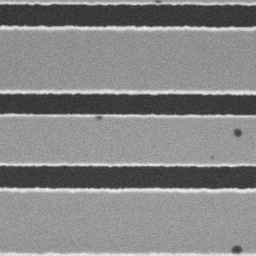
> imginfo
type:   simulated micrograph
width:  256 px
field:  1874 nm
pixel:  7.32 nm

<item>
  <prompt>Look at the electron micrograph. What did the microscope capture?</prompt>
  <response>lines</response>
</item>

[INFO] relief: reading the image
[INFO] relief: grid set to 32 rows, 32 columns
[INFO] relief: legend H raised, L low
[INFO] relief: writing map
LLLLLHLLLLLHHHHLHHHHLHHLHHHHHHHH
LLLLLLLLLLLLLLLLLLLLLLLLLLLLLLLL
LLLLLLLLLLLLLLLLLLLLLLLLLLLLLLLL
HHHHHHHHHHHHHHHHHHHHHHHHHHHHHHHH
HHHHHHHHHHHHHHHHHHHHHHHHHHHHHHHH
HHHHHHHHHHHHHHHHHHHHHHHHHHHHHHHH
HHHHHHHHHHHHHHHHHHHHHHHHHHHHHHHH
HHHHHHHHHHHHHHHHHHHHHHHHHHHHHHHH
HHHHHHHHHHHHHHHHHHHHHHHHHHHHHHHH
HHHHHHHHHHHHHHHHHHHHHHHHHHHHHHHH
HHHHHHHHHHHHHHHHHHHHHHHHHHHHHHHH
HHHHHHHHHHHHHHHHHHHHHHHHHHHHHHHH
LLLLLLLLLLLLLLLLLLLLLLLLLLLLLLLL
LLLLLLLLLLLLLLLLLLLLLLLLLLLLLLLL
HHHHHHHHHHHHHHHHHHHHHHLHHHHHHLLL
HHHHHHHHHHHHHHHHHHHHHHHHHHHHHHHH
HHHHHHHHHHHHHHHHHHHHHHHHHHHHHHHH
HHHHHHHHHHHHHHHHHHHHHHHHHHHHHHHH
HHHHHHHHHHHHHHHHHHHHHHHHHHHHHHHH
HHHHHHHHHHHHHHHHHHHHHHHHHHHHHHHH
HHHHHHHHHHHHHHHHHHHHHHHHHHHHHHHH
LLLLLLLLLLLLLLLLLLLLLLLLLLLLLLLL
LLLLLLLLLLLLLLLLLLLLLLLLLLLLLLLL
LHLLHLLLLLLLLLLLLLLLLLLLLLLLLLLL
HHHHHHHHHHHHHHHHHHHHHHHHHHHHHHHH
HHHHHHHHHHHHHHHHHHHHHHHHHHHHHHHH
HHHHHHHHHHHHHHHHHHHHHHHHHHHHHHHH
HHHHHHHHHHHHHHHHHHHHHHHHHHHHHHHH
HHHHHHHHHHHHHHHHHHHHHHHHHHHHHHHH
HHHHHHHHHHHHHHHHHHHHHHHHHHHHHHHH
HHHHHHHHHHHHHHHHHHHHHHHHHHHHHHHH
HHHHHHHHHHHHHHHHHHHHHHHHHHHHHHHH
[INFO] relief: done